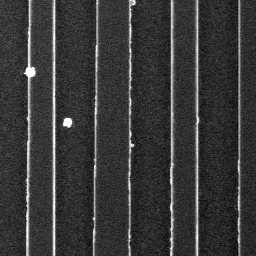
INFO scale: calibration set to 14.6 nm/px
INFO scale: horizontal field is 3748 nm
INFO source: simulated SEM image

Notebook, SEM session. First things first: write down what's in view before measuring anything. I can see lines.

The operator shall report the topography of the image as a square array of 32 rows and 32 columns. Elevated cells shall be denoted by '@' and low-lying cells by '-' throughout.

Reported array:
----@@@-----@@@@-----@@@@-----@@
----@@@-----@@@@-----@@@@-----@@
----@@@-----@@@@-----@@@@-----@@
----@@@-----@@@@-----@@@@-----@@
----@@@-----@@@@-----@@@@-----@@
----@@@-----@@@@-----@@@@-----@@
----@@@-----@@@@-----@@@@-----@@
----@@@-----@@@@-----@@@@-----@@
---@@@@-----@@@@-----@@@@-----@@
---@@@@-----@@@@-----@@@@-----@@
----@@@-----@@@@-----@@@@-----@@
----@@@-----@@@@-----@@@@-----@@
----@@@-----@@@@-----@@@@-----@@
----@@@-----@@@@-----@@@@-----@@
---@@@@-----@@@@-----@@@@-----@@
----@@@-----@@@@-----@@@@-----@@
----@@@-----@@@@-----@@@@-----@@
---@@@@-----@@@@-----@@@@-----@@
---@@@@-----@@@@-----@@@@-----@@
---@@@@-----@@@@-----@@@@-----@@
---@@@@-----@@@@-----@@@@-----@@
---@@@@-----@@@@-----@@@@-----@@
---@@@@-----@@@@-----@@@@-----@@
---@@@@-----@@@@-----@@@@-----@@
---@@@@-----@@@@-----@@@@-----@@
---@@@@-----@@@@-----@@@@-----@@
---@@@@-----@@@@-----@@@@-----@@
---@@@@-----@@@@-----@@@@-----@@
---@@@@-----@@@@-----@@@@-----@@
---@@@@-----@@@@-----@@@@-----@@
---@@@@-----@@@@-----@@@@-----@@
---@@@@-----@@@@-----@@@@-----@@